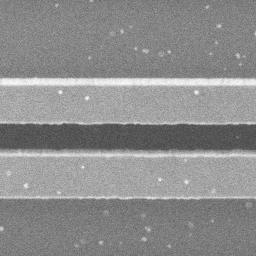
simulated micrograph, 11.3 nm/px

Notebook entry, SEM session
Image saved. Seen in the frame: lines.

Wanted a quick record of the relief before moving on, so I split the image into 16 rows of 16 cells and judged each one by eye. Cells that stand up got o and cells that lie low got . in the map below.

................
................
................
................
................
oooooooooooooooo
oooooooooooooooo
oooooooooooooooo
................
.o..............
oooooooooooooooo
oooooooooooooooo
................
................
................
................